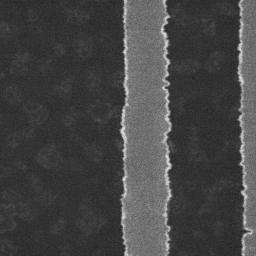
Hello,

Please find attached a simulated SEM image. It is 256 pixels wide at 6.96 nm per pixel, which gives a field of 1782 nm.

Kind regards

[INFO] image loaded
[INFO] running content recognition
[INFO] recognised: one or a few lines or trenches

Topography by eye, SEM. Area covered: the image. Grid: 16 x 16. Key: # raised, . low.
........##.....#
........##.....#
........##.....#
........##.....#
........##.....#
........##.....#
........##.....#
........###....#
........##.....#
........###....#
........###....#
........###....#
........###....#
........##.....#
........###....#
........###....#